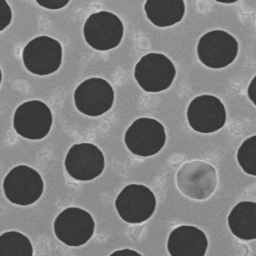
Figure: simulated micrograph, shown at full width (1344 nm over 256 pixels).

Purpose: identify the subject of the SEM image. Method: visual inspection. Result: a regular array of holes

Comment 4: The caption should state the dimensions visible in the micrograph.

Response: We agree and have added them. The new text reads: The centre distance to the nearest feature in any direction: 343 nanometers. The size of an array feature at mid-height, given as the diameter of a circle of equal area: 0.204 um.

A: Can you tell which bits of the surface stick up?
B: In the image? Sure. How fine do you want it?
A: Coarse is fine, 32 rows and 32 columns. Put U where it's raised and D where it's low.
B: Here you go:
DUUUUDDDUUUUUUUUUUDDDDDUUUUUUUUU
DUUUUUUUUUUUDDUUUUDDDDDUUUUUUUUU
DUUUUUUUUUUDDDDUUUUDDDUUUUUUUUUU
DUUUUUUUUUDDDDDUUUUUUUUUUUUUUUUU
UUUUUUUUUUUDDDDUUUUUUUUUUDDDDUUU
UUUDDDDUUUUDDDDUUUUUUUUUUDDDDDUU
UUUDDDDDUUUUUUUUUUUUUUUUUDDDDDUU
UUUDDDDDUUUUUUUUUDDDDUUUUDDDDUUU
UUUDDDDUUUUUUUUUUDDDDDUUUUUUUUUU
UUUUUUUUUUUUUUUUUDDDDDUUUUUUUUUU
UUUUUUUUUUDDDDUUUDDDDUUUUUUUUUUD
UUUUUUUUUDDDDDUUUUUUUUUUUUUUUUUD
UUUUUUUUUDDDDDUUUUUUUUUUDDDUUUUD
UUDDDDUUUUDDDDUUUUUUUUUUDDDDUUUU
UUDDDDUUUUUUUUUUUUUUUUUDDDDDUUUU
UUDDDDUUUUUUUUUUUDDDUUUUDDDDUUUU
UUDDDDUUUUUUUUUUDDDDDUUUUDUUUUUU
UUUUUUUUUUUUUUUUDDDDDUUUUUUUUUUD
UUUUUUUUUDDDUUUUDDDDUUUUUUUUUUDD
UUUUUUUUDDDDDUUUUUUUUUUUUUUUUUDD
UUUUUUUUDDDDDUUUUUUUUUUUUUUUUUDD
UDDDDUUUUDDDDUUUUUUUUUUUUUUUUUUD
UDDDDUUUUUDUUUUUUUUUUUUUUUUUUUUU
DDDDDUUUUUUUUUUUDDUUUUUUUUUUUUUU
UDDDDUUUUUUUUUUDDDDUUUUUUUUUUUUU
UUDDUUUUUUUUUUDDDDDUUUUUUUUUUUDD
UUUUUUUUDDDUUUUDDDDUUUUUUUUUUDDD
UUUUUUUDDDDDUUUUDDUUUUUUUUUUUDDD
UUUUUUUDDDDDUUUUUUUUUUDDUUUUUDDD
DDDUUUUDDDDUUUUUUUUUUDDDDDUUUUDD
DDDDUUUUDDUUUUUUUUUUUDDDDDUUUUUU
DDDDUUUUUUUUUUDDDUUUUDDDDDUUUUUU